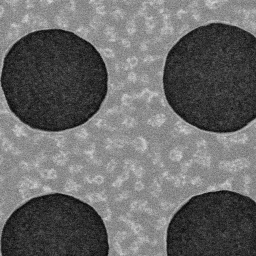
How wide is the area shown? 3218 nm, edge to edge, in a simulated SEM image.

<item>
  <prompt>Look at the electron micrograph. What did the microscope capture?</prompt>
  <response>holes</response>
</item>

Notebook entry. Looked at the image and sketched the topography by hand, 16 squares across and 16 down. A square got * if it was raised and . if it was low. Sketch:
****************
*************.**
*....******.....
......****......
.......***......
.......***......
......*****.....
*.....******....
****************
****************
****************
****************
**...*******....
*.....*****.....
.......***......
.......***......